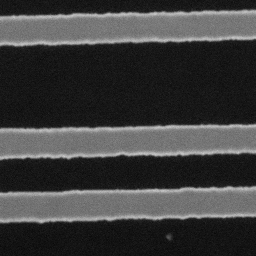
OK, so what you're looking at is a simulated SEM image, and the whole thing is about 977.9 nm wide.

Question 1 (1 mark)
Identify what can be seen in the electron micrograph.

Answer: lines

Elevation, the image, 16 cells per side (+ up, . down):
................
++++++++++++++++
++++++++++++++..
................
................
................
................
................
++++++++++++++++
++++++++++++++++
................
................
++++++++++++++++
++++++++++++++++
................
................